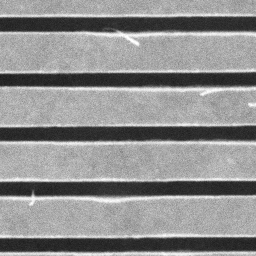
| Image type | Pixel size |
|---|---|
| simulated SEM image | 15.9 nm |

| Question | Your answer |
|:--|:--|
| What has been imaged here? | lines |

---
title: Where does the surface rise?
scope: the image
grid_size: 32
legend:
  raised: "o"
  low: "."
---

oooooooooooooooooooooooooooooooo
oooooooooooooooooooooooooooooooo
................................
................................
oooooooooooooooooooooooooooooooo
oooooooooooooooooooooooooooooooo
oooooooooooooooooooooooooooooooo
oooooooooooooooooooooooooooooooo
oooooooooooooooooooooooooooooooo
................................
................................
oooooooooooooooooooooooooooooooo
oooooooooooooooooooooooooooooooo
oooooooooooooooooooooooooooooooo
oooooooooooooooooooooooooooooooo
oooooooooooooooooooooooooooooooo
................................
................................
oooooooooooooooooooooooooooooooo
oooooooooooooooooooooooooooooooo
oooooooooooooooooooooooooooooooo
oooooooooooooooooooooooooooooooo
oooooooooooooooooooooooooooooooo
................................
....o...........................
oooooooooooooooooooooooooooooooo
oooooooooooooooooooooooooooooooo
oooooooooooooooooooooooooooooooo
oooooooooooooooooooooooooooooooo
oooooooooooooooooooooooooooooooo
................................
................................